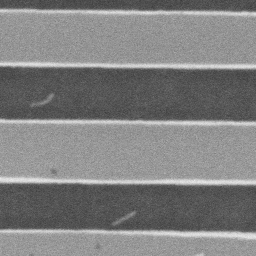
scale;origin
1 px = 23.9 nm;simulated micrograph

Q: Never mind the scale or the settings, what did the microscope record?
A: lines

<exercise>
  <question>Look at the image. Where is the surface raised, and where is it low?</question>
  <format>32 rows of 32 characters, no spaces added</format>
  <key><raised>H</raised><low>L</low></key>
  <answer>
LLLLLLLLLLLLLLLLLLLLLLLLLLLLLLLL
HHHHHHHHHHHHHHHHHHHHHHHLLLLLLLLL
HHHHHHHHHHHHHHHHHHHHHHHHHHHHHHHH
HHHHHHHHHHHHHHHHHHHHHHHHHHHHHHHH
HHHHHHHHHHHHHHHHHHHHHHHHHHHHHHHH
HHHHHHHHHHHHHHHHHHHHHHHHHHHHHHHH
HHHHHHHHHHHHHHHHHHHHHHHHHHHHHHHH
HHHHHHHHHHHHHHHHHHHHHHHHHHHHHHHH
LLLLLLLLLLLLLLLLLLLLLLLLLLLLLHHH
LLLLLLLLLLLLLLLLLLLLLLLLLLLLLLLL
LLLLLLLLLLLLLLLLLLLLLLLLLLLLLLLL
LLLLLLLLLLLLLLLLLLLLLLLLLLLLLLLL
LLLLLLLLLLLLLLLLLLLLLLLLLLLLLLLL
LLLLLLLLLLLLLLLLLLLLLLLLLLLLLLLL
LLLLLLLLLLLLLLLLLLLLLLLLLLLLLLLL
HHHHHHHHHHHHHHHHHHHHHHHHHHHHHHHH
HHHHHHHHHHHHHHHHHHHHHHHHHHHHHHHH
HHHHHHHHHHHHHHHHHHHHHHHHHHHHHHHH
HHHHHHHHHHHHHHHHHHHHHHHHHHHHHHHH
HHHHHHHHHHHHHHHHHHHHHHHHHHHHHHHH
HHHHHHHHHHHHHHHHHHHHHHHHHHHHHHHH
HHHHHHHHHHHHHHHHHHHHHHHHHHHHHHHH
HHHHHHHHHHHHHHHHHHHHHHHHHHHHHHHH
LLLLLLLLLLLLLLLLLLLLLLLLLLLLLLLL
LLLLLLLLLLLLLLLLLLLLLLLLLLLLLLLL
LLLLLLLLLLLLLLLLLLLLLLLLLLLLLLLL
LLLLLLLLLLLLLLLLLLLLLLLLLLLLLLLL
LLLLLLLLLLLLLLLLLLLLLLLLLLLLLLLL
LLLLLLLLLLLLLLLLLLLLLLLLLLLLLLLL
HHHHHHHHHHHHHHHHHHHHHHHHHHHHHHHH
HHHHHHHHHHHHHHHHHHHHHHHHHHHHHHHH
HHHHHHHHHHHHHHHHHHHHHHHHHHHHHHHH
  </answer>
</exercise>